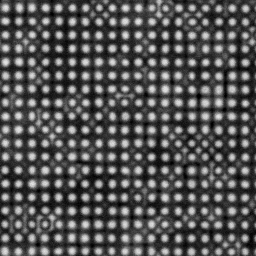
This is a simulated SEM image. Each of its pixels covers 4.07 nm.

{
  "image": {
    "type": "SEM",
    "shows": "a regular array of raised bodies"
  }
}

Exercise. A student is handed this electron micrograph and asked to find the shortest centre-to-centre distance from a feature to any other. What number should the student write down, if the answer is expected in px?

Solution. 12.9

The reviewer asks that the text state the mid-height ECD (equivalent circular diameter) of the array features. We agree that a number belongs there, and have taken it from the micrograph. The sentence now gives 0.0297 micrometres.